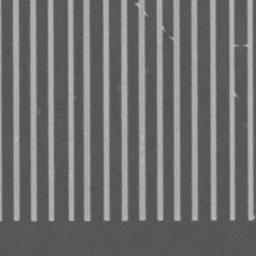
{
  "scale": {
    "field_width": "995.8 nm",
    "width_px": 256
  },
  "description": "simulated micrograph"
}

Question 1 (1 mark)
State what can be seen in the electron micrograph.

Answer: parallel lines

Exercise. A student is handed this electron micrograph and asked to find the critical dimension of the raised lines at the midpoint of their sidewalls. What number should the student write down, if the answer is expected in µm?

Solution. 0.0195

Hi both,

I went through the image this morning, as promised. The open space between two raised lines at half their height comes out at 49.2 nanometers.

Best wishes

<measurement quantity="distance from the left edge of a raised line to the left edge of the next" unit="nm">70.2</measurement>